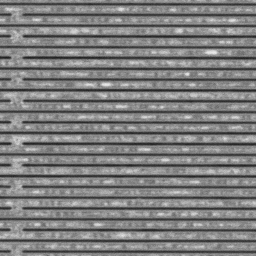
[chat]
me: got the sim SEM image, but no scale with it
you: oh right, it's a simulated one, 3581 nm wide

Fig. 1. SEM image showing parallel lines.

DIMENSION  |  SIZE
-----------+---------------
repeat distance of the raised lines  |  150 nanometers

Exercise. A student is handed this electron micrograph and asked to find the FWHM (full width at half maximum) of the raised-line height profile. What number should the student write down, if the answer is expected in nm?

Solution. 107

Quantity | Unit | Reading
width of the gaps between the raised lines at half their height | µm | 0.0402